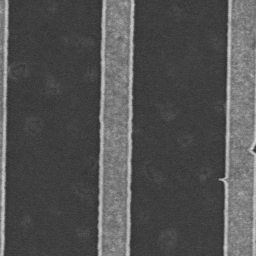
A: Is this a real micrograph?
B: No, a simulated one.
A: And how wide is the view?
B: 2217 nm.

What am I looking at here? one or a few lines or trenches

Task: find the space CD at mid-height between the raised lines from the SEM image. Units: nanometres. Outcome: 846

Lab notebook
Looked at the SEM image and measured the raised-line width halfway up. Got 247 nanometres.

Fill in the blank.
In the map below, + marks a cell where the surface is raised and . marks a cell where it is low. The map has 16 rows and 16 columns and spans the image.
......++......++
......++......++
......++......++
......++......++
......++......++
......++......++
......++......++
......++......++
......++......++
......++......++
......++......++
......++......++
......++......++
......++......++
......++......++
......++......++